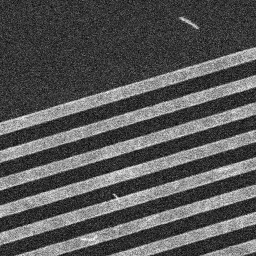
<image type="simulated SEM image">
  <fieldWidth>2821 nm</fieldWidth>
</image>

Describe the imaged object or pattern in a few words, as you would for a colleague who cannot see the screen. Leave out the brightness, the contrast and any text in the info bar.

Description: parallel lines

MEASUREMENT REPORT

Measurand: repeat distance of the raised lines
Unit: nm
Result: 290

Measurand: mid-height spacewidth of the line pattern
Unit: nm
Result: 166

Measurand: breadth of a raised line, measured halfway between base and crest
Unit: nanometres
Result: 123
